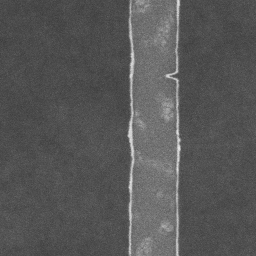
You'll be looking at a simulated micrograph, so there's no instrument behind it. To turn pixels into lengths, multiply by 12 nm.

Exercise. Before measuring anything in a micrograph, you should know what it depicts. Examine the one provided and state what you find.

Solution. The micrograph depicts one or a few lines or trenches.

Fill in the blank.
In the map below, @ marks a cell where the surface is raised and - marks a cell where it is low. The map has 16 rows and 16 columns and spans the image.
@@@@@@@@---@@@@@
@@@@@@@@---@@@@@
@@@@@@@@---@@@@@
@@@@@@@@---@@@@@
@@@@@@@@---@@@@@
@@@@@@@@---@@@@@
@@@@@@@@---@@@@@
@@@@@@@@---@@@@@
@@@@@@@@---@@@@@
@@@@@@@@---@@@@@
@@@@@@@@---@@@@@
@@@@@@@@---@@@@@
@@@@@@@@---@@@@@
@@@@@@@@---@@@@@
@@@@@@@@---@@@@@
@@@@@@@@---@@@@@